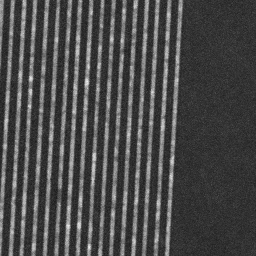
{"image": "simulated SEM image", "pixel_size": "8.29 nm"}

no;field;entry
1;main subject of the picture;parallel lines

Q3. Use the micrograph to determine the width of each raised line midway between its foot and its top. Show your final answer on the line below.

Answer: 26.9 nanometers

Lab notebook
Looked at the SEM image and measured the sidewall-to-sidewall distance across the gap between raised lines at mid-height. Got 68.3 nanometers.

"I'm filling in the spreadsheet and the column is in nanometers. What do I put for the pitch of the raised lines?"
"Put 92.6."